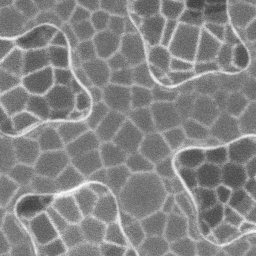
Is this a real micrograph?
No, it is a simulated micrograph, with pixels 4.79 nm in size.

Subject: raised bodies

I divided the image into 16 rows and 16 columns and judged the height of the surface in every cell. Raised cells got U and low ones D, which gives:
DDDDDDDDUUUUUUDD
DDDDDDDDUUUUUUDD
UUUUDDDDDUUUUUUD
UUUUDDDDDUUUUUUU
UUUUUDDDDUUUUUUD
UUUUUDDDDDDDDDDD
UUUUUUDDDDDDDDDD
UUUUUDDDDDDDDDDD
DDDDDDDDDDDDDDDU
DDDDDDDDDDDUUUUU
DDDDDDDDDDDUUUUU
DDDDDUDDDDDUUUUU
DUUUUUUDDDDDUUUU
DUUUUUUDDDDDUUUU
DDUUUUUUDDDDDUUU
DDUUUUUUDDDDDDDD